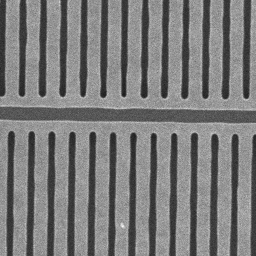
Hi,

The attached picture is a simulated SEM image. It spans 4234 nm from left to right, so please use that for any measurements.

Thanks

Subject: groups of lines, slits or small figures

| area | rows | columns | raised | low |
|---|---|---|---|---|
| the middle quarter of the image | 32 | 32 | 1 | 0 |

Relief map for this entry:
01110011100111001110011100111001
01110011100111001110011100111001
01110011100111001110011100111001
01110011100111001110011100111001
01110011100111001110011100111001
01110011100111001110011100111001
01110011100111001110011100111001
01110011100111001110011100111001
11111111101111111110011110111101
11111111111111111111111111111111
11111111111111111111111111111111
00000000000000000000000000000000
00000000000000000000000000000000
00000000000000000000000000000000
11111111111111111110000000000000
11111111111111111111111111111111
11111111111111111111111111111111
10011100111101111011110111101111
10011100111001110011100111101111
10011100111001110011100111001111
10011100111001110011100111001111
10011100111001110011100111001111
10011100111001110011100111001111
10011100111001110011100111001111
10011100111001110011100111001111
10011100111001110011100111001111
10011100111001110011100111001111
10011100111001110011100111001111
10011100111001110011100111001111
10011100111001110011100111001111
10011100111001110011100111001111
10011100111001110011100111001111